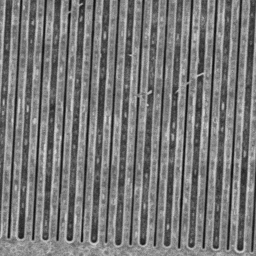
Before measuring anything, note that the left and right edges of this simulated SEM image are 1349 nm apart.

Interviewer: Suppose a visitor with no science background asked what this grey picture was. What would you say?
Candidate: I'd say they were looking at parallel lines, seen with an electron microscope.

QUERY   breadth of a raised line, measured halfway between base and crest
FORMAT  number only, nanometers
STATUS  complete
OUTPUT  35.5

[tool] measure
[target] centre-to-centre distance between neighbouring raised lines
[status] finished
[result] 12.1 px